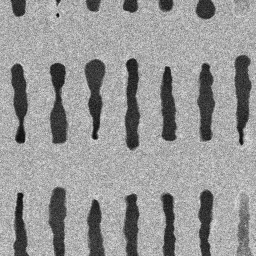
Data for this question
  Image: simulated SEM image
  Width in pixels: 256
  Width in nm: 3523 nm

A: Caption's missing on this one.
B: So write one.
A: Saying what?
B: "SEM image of holes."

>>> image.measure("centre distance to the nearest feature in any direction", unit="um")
0.514